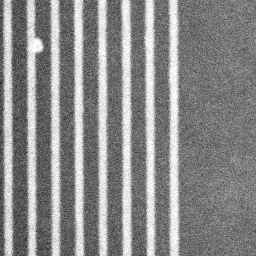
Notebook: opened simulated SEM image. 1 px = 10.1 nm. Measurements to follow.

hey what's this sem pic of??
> parallel lines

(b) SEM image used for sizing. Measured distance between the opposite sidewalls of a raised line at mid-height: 67.1 nm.